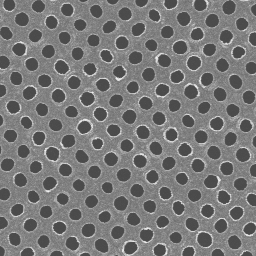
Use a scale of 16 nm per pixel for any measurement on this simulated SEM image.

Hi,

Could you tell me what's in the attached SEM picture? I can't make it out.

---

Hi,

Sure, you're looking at a regular array of holes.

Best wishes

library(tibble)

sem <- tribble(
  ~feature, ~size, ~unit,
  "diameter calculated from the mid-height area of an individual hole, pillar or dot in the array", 206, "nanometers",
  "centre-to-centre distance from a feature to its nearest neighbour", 323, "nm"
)